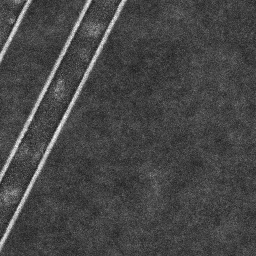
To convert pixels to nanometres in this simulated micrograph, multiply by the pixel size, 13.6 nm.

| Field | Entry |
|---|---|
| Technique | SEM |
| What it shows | one or a few lines or trenches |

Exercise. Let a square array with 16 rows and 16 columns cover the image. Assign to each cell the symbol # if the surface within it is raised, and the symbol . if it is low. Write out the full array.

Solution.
..###...########
.####..#########
.###...#########
####..##########
###..###########
###..###########
##..############
##..############
#..#############
#..#############
..##############
..##############
.###############
.###############
################
################